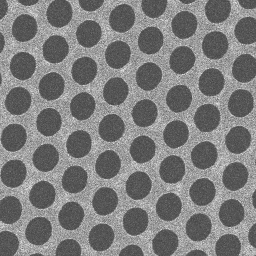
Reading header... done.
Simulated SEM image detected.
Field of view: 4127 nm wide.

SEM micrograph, a regular array of holes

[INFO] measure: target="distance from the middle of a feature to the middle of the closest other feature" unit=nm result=576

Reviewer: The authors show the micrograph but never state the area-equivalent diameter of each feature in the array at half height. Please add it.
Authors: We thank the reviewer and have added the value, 27 pixels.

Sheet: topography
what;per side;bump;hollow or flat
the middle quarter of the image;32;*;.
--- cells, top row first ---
**......***....****....***......
**......**********......***....*
**......**********.......***..**
**......****..****......********
***....****....***......********
**********......***....*****...*
**********......****..****.....*
***...****......**********......
**.....***......*********.......
**......***....***....***.......
*.......**********.....***.....*
*.......*********......****....*
**.....*****.****......*********
***...****....***......*********
*********......**......****...**
*********......***...****......*
*********......**********......*
**....***......**********......*
*......**.....****....***......*
*......**********......**......*
*......**********......***....**
*......****.****.......*********
*.....***....****......*********
***.****......***.....***....***
********......****...***......**
**..****......**********......**
.....***......**********......**
......**.....****....***......**
......****..****.....***......**
......**********......***...****
.....**********.......**********
.....****...***.......*********.